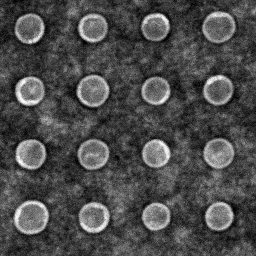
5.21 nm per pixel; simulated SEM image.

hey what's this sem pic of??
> a regular array of raised bodies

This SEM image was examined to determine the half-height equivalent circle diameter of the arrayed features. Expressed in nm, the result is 151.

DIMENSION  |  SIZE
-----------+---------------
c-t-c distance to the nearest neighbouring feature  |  326 nanometres